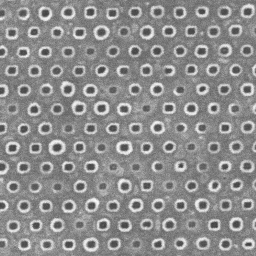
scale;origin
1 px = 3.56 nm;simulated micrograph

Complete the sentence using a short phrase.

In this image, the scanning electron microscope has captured a regular array of holes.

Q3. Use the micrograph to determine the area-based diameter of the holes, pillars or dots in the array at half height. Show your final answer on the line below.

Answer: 0.0284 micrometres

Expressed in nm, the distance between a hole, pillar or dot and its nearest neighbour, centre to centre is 77.5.